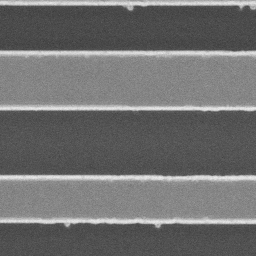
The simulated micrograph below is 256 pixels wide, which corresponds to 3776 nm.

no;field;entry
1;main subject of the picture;lines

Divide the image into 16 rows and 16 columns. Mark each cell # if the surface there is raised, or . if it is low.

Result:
................
................
................
################
################
################
################
................
................
................
................
################
################
################
................
................